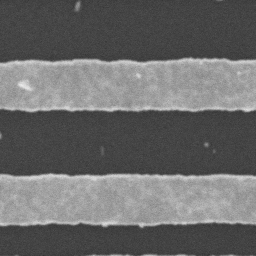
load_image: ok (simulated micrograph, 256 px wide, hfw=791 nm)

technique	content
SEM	lines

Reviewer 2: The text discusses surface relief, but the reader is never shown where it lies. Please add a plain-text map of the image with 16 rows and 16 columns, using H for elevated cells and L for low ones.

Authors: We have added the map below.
LLLLLLLLLLLLLLLL
LLLLLLLLLLLLLLLL
LLLLLLLLLLLLLLLL
LLLLLLLLLLLLLLLL
HHHHHHHHHHHHHHHH
HHHHHHHHHHHHHHHH
HHHHHHHHHHHHHHHH
LLLLLLLLLLLLLLLL
LLLLLLLLLLLLLLLL
LLLLLLLLLLLLLLLL
LLLLLLLLLLLLLLLL
HHHHHHHHHHHHHHHH
HHHHHHHHHHHHHHHH
HHHHHHHHHHHHHHHH
LLLLLLLLLLLLLLLL
LLLLLLLLLLLLLLLL